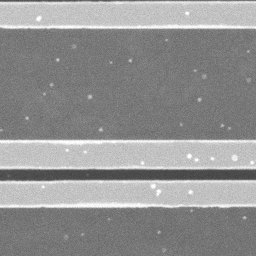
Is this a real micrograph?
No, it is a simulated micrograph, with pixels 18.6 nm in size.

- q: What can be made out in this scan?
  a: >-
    lines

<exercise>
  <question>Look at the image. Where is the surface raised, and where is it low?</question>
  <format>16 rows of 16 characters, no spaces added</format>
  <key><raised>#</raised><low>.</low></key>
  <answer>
################
################
................
................
................
................
................
................
................
################
################
################
################
................
................
................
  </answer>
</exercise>